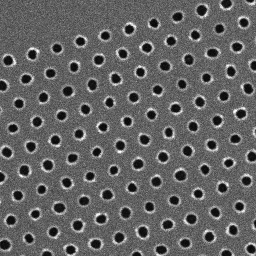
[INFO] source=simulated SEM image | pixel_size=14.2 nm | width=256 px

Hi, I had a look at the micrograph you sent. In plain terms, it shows a regular array of holes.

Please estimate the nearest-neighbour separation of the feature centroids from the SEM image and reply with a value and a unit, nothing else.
350 nm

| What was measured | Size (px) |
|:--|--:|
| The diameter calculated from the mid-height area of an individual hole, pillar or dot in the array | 9.64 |